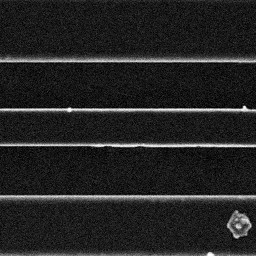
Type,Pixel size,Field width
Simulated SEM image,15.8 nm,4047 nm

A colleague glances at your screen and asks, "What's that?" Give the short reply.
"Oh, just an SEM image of lines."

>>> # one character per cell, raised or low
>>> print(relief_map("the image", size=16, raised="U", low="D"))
UUUUUUUUUUUUUUUU
UUUUUUUUUUUUUUUU
UUUUUUUUUUUUUUUU
UUUUUUUUUUUUUUUU
DDDDDDDDDDDDDDDD
DDDDDDDDDDDDDDDD
DDDDDDDDDDDDDDDD
UUUUUUUUUUUUUUUU
UUUUUUUUUUUUUUUU
DDDDDDDDDDDDDDDD
DDDDDDDDDDDDDDDD
DDDDDDDDDDDDDDDD
UUUUUUUUUUUUUUUU
UUUUUUUUUUUUUUUU
UUUUUUUUUUUUUUUU
UUUUUUUUUUUUUUUU